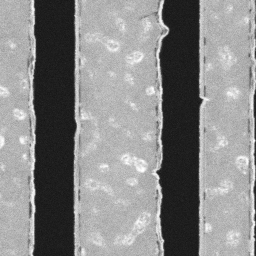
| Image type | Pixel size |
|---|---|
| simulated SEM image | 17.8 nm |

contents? one or a few lines or trenches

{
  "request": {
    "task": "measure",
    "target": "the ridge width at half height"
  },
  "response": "0.793 micrometres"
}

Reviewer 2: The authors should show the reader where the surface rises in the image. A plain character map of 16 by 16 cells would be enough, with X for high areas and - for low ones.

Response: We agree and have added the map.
--XXX-----XXX---
--XXX-----XXX---
--XXX-----XXX---
--XXX-----XXX---
--XXX-----XXX---
--XXX-----XXX---
--XXX-----XXX---
--XXX-----XXX---
--XXX-----XXX---
--XXX-----XXX---
--XXX-----XXX---
--XXX-----XXX---
--XXX-----XXX---
--XXX-----XXX---
--XXX-----XXX---
--XXX-----XXX---